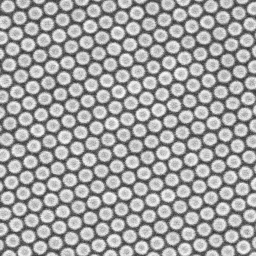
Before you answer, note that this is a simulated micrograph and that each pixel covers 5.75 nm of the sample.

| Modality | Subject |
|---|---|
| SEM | a regular array of raised bodies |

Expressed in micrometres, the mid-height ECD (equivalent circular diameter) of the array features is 0.0692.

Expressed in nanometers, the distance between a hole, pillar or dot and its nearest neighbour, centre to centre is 91.8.